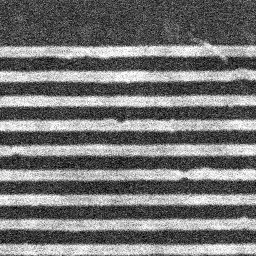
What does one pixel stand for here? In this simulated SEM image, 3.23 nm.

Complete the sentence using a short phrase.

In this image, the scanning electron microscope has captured parallel lines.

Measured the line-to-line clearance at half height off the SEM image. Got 48.9 nm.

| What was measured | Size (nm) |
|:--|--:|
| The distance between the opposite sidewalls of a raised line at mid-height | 30.3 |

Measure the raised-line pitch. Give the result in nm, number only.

80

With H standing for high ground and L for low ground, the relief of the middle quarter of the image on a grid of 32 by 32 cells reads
LLLLLLLLLLLLLLLLLLLLLLLLLLLLLLLL
LLLLLLLLLLLLLLLLLLLLLLLLLLLLLLLL
HHHHHHHHHHHHHHHHHHHHHHHHHHHHHHHH
HHHHHHHHHHHHHHHHHHHHHHHHHHHHHHHH
LLLLLLLLLLLLLLLLLLLLLLLLLLLLLLLL
LLLLLLLLLLLLLLLLLLLLLLLLLLLLLLLL
LLLLLLLLLLLLLLLLLLLLLLLLLLLLLLLL
LLLLLLLLLLLLLLLLLLLLLLLLLLLLLLLL
HHHHHHHHHHHHHHHHHHHHHHHHHHHHHHHH
HHHHHHHHHHHHHHHHHHHHHHHHHHHHHHHH
LLLLLLLLLLHHHHHHHHHHLLLLLLLLLLLL
LLLLLLLLLLLLLLLLLLLLLLLLLLLLLLLL
LLLLLLLLLLLLLLLLLLLLLLLLLLLLLLLL
LLLLLLLLLLLLLLLLLLLLLLLLLLLLLLLL
HHHHHHHHHHHHHLLHHHHHHHHHHHHHHHHH
HHHHHHHHHHHHHHHHHHHHHHHHHHHHHHHH
LLLLLLLLLLLLLLLLLLLHHHHHHLHHLLLL
LLLLLLLLLLLLLLLLLLLLLLLLLLLLLLLL
LLLLLLLLLLLLLLLLLLLLLLLLLLLLLLLL
LLLLLLLLLLLLLLLLLLLLLLLLLLLLLLLL
HHHHHHHHHHHHHHHHHLLLLHHHHHHHHHHH
HHHHHHHHHHHHHHHHHHHHHHHHHHHHHHHH
HHHHHHHHHHHHHHHHHHHHHHHHHHHHHHHH
LLLLLLLLLLLLLLLLLLLLLLLLLLLLLLLL
LLLLLLLLLLLLLLLLLLLLLLLLLLLLLLLL
LLLLLLLLLLLLLLLLLLLLLLLLLLLLLLLL
LLLLLLLLLLLLLLLLLLLLLLLLLHLLLLLL
HHHHHHHHHHHHHHHHHHHHHHHHHHHHHHHH
HHHHHHHHHHHHHHHHHHHHHHHHHHHHHLLH
LLLLLLLLLLLLLLLLLLLLLLLLLLLLLLLL
LLLLLLLLLLLLLLLLLLLLLLLLLLLLLLLL
LLLLLLLLLLLLLLLLLLLLLLLLLLLLLLLL